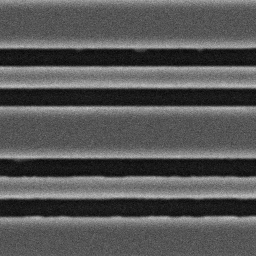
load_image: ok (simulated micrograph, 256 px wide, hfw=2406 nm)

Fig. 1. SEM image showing lines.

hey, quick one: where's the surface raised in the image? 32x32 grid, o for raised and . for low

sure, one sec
oooooooooooooooooooooooooooooooo
oooooooooooooooooooooooooooooooo
oooooooooooooooooooooooooooooooo
oooooooooooooooooooooooooooooooo
oooooooooooooooooooooooooooooooo
oooooooooooooooooooooooooooooooo
................................
................................
oooooooooooooooooooooooooooooooo
oooooooooooooooooooooooooooooooo
oooooooooooooooooooooooooooooooo
................................
................................
oooooooooooooooooooooooooooooooo
oooooooooooooooooooooooooooooooo
oooooooooooooooooooooooooooooooo
oooooooooooooooooooooooooooooooo
oooooooooooooooooooooooooooooooo
oooooooooooooooooooooooooooooooo
oooooooooooooooooooooooooooooooo
................................
................................
oooooooooooooooooooooooooooooooo
oooooooooooooooooooooooooooooooo
oooooooooooooooooooooooooooooooo
................................
................................
oooooooooooooooooooooooooooooooo
oooooooooooooooooooooooooooooooo
oooooooooooooooooooooooooooooooo
oooooooooooooooooooooooooooooooo
oooooooooooooooooooooooooooooooo